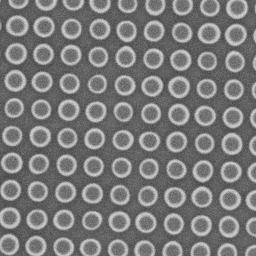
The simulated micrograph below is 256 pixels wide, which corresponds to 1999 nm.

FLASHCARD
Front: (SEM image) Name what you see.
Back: an array of small figures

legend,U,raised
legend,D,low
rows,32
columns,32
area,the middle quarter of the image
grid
DDDDDDDDUUDDDDUUUDDDDUUUDDDUUUUD
DDDDDDDDDDDDDDDDDDDDDDDDDDDDUUDD
DDDDDDDDDDDDDDDDDDDDDDDDDDDDDDDD
UUUDDDDUUUDDDDUUUDDDDUUUDDDDUUDD
UUUUDDUUUUUDDUUUUUDDUUUUUDUUUUUD
UUUUDDUUUUUDDUUUUUDUUUUUUDUUUUUD
UUUDDDDUUUDDDUUUUDDDUUUUDDUUUUUD
DDDDDDDDDDDDDDUUDDDDUUUUDDDUUUUD
DDDDDDDDDDDDDDDDDDDDDDDDDDDDDDDD
UUUDDDDDDDDDDDDDDDDDDDDDDDDDDDDD
UUUUDDUUUUDDDUUUUDDDUUUDDDDUUUDD
UUUUDDUUUUDDDUUUUDDDUUUUDDUUUUUD
UUUUDDUUUUDDDUUUUDDUUUUUDDUUUUUD
UUUDDDUUUUDDDUUUUDDDUUUUDDUUUUUD
DDDDDDDDDDDDDDDDDDDDDUUDDDDUUUUD
DDDDDDDDDDDDDDDDDDDDDDDDDDDDDDDD
UUDDDDUUUDDDDDDDDDDDDDDDDDDDDDDD
UUUDDDUUUUDDDUUUUDDDUUUDDDDUUUDD
UUUDDUUUUUDDUUUUUDDUUUUUDDUUUUDD
UUUDDUUUUUDDUUUUUDDUUUUUDDUUUUUD
UUDDDDUUUDDDDUUUUDDUUUUDDDUUUUDD
DDDDDDDDDDDDDDDDDDDDUUDDDDUUUUDD
DDDDDDDDDDDDDDDDDDDDDDDDDDDDDDDD
UUDDDDUUUDDDDDDDDDDDDDDDDDDDDDDD
UUUDDUUUUUDDUUUUDDDDUUUDDDUUUDDD
UUUDDUUUUUDDUUUUUDDUUUUDDDUUUUDD
UUUDDUUUUUDDUUUUUDDUUUUDDDUUUUDD
UUDDDDUUUDDDDUUUDDDUUUUDDDUUUUDD
DDDDDDDDDDDDDDDDDDDDUUDDDDDUUDDD
DDDDDDDDDDDDDDDDDDDDDDDDDDDDDDDD
UUDDDDUUUDDDDUUDDDDDDDDDDDDDDDDD
UUUDDUUUUDDDUUUUDDDUUUUDDDUUUUDD